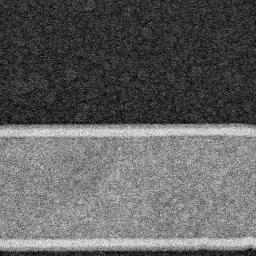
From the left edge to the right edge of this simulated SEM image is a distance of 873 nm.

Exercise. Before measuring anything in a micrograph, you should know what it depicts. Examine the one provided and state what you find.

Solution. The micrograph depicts one or a few lines or trenches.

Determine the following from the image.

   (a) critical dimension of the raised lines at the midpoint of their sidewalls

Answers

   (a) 378 nm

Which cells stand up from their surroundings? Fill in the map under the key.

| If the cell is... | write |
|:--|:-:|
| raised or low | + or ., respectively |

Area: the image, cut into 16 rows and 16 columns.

................
................
................
................
................
................
................
................
++++++++++++++++
++++++++++++++++
++++++++++++++++
++++++++++++++++
++++++++++++++++
++++++++++++++++
++++++++++++++++
................